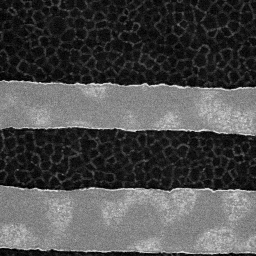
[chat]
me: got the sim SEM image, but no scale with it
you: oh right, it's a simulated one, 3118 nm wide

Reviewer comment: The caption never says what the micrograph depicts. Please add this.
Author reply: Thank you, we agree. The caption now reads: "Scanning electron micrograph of one or a few lines or trenches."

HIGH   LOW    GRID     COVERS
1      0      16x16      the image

0000000000000000
0000000000000000
0000000000000000
0000000000000000
0000000000000000
1111111111111001
1111111111111111
1111111111111111
0000000000000000
0000000000000000
0000000000000000
0000000000000000
1111111111111111
1111111111111111
1111111111111111
0111111111111111